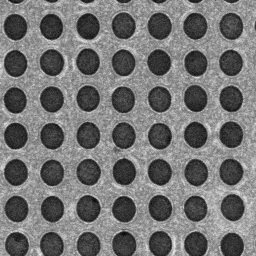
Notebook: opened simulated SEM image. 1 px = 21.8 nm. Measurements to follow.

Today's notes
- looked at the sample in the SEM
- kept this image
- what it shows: a regular array of holes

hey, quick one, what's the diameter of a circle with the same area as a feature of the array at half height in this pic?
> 565 nm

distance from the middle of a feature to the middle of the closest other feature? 0.774 micrometres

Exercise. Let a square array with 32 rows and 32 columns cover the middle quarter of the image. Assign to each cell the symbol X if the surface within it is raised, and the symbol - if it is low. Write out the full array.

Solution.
XXX------XXX------XXX------XXX--
XXXX-----XXX------XXX-----XXXX--
XXXXX---XXXXX----XXXXX----XXXXX-
XXXXXXXXXXXXXXXXXXXXXXXXXXXXXXXX
XXXXXXXXXXXXXXXXXXXXXXXXXXXXXXXX
XXXXX--XXXXXXXXXXXXXXXX--XXXXXX-
XXXX----XXXX-----XXXXX----XXXX--
XXX------XXX------XXX------XXX--
XXX------XXX------XXX------XXX--
XXX------XXX------XXX------XXX--
XXX------XXX------XXX------XXX--
XXXX----XXXXX----XXXXX----XXXXX-
XXXXXXXXXXXXXXXXXXXXXXXXXXXXXXXX
XXXXXXXXXXXXXXXXXXXXXXXXXXXXXXXX
XXXXXX-XXXXXXXXXXXXXXXX-XXXXXXXX
XXXX----XXXXX----XXXXX----XXXXX-
XXX------XXX------XXX------XXX--
XXX------XXX------XXX------XXX--
XXX------XXX------XXX------XXX--
XXX------XXX------XXX------XXX--
XXXX----XXXXX----XXXXX----XXXXX-
XXXXXXXXXXXXXXXXXXXXXXXXXXXXXXXX
XXXXXXXXXXXXXXXXXXXXXXXXXXXXXXXX
XXXXXXXXXXXXXXXXXXXXXXX-XXXXXXXX
XXXX----XXXXX----XXXXX----XXXXX-
XXX------XXX------XXX------XXX--
XXX------XXX------XXX------XXX--
XXX------XXX------XXX------XXX--
XXX------XXX------XXX------XXX--
XXXX----XXXXX----XXXXX----XXXXX-
XXXXXX-XXXXXXXXXXXXXXXXXXXXXXXXX
XXXXXXXXXXXXXXXXXXXXXXXXXXXXXXXX